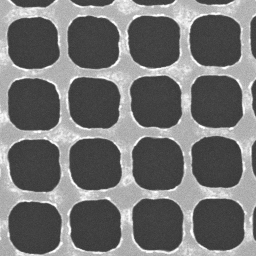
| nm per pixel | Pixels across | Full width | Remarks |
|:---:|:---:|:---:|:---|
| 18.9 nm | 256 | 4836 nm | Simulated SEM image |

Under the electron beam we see a regular array of holes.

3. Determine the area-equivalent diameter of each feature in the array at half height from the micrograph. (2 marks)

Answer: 1050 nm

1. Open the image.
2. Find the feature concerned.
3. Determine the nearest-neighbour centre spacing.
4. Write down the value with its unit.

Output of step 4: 60.4 pixels